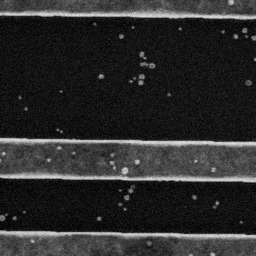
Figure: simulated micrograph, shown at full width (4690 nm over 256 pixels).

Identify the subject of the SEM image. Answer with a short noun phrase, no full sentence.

lines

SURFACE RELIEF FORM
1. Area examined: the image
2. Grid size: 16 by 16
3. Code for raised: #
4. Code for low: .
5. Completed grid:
################
................
................
................
................
................
................
................
................
################
################
................
................
................
##..............
################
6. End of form